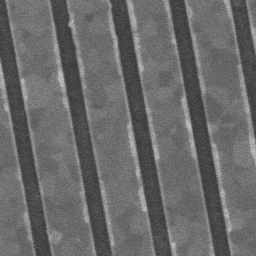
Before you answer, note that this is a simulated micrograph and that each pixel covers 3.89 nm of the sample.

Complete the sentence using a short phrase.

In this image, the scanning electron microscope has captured parallel lines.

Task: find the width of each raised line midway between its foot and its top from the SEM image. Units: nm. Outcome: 162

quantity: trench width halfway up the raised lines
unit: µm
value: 0.0669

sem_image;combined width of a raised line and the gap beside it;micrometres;0.229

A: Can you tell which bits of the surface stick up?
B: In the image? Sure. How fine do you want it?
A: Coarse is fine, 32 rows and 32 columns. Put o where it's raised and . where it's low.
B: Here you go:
.ooooo..oooooo..ooooo..oooooo..o
.ooooo...ooooo..ooooo..oooooo..o
.oooooo..ooooo..ooooo...ooooo..o
.oooooo..ooooo...ooooo..ooooo..o
..ooooo..ooooo...ooooo..ooooo...
..ooooo..oooooo..ooooo..oooooo..
..ooooo...ooooo..ooooo..oooooo..
..ooooo...ooooo..ooooo...ooooo..
..oooooo..ooooo..oooooo..ooooo..
..oooooo..ooooo...ooooo..ooooo..
o..ooooo..ooooo...ooooo..oooooo.
o..ooooo..oooooo..ooooo..oooooo.
o..ooooo...ooooo..ooooo..oooooo.
o..oooooo..ooooo..ooooo...ooooo.
o..oooooo..ooooo..oooooo..ooooo.
o...ooooo..ooooo...ooooo..ooooo.
oo..ooooo..oooooo..ooooo..oooooo
oo..ooooo..oooooo..ooooo..oooooo
oo..ooooo...ooooo..ooooo...ooooo
oo..oooooo..ooooo..oooooo..ooooo
oo..oooooo..ooooo...ooooo..ooooo
ooo..ooooo..ooooo...ooooo..ooooo
ooo..ooooo..oooooo..ooooo..ooooo
ooo..ooooo...ooooo..ooooo..ooooo
ooo..oooooo..ooooo..ooooo...oooo
ooo..oooooo..ooooo..oooooo..oooo
ooo...ooooo..ooooo...ooooo..oooo
oooo..ooooo..oooooo..ooooo..oooo
oooo..ooooo..oooooo..ooooo..oooo
oooo..ooooo...ooooo..ooooo..oooo
oooo..oooooo..ooooo..ooooo...ooo
oooo..oooooo..ooooo..oooooo..ooo